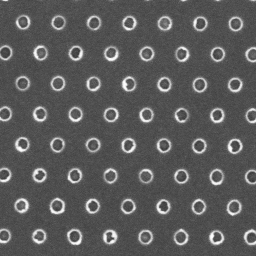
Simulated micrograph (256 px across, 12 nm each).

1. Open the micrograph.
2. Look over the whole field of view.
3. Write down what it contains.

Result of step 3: a regular array of holes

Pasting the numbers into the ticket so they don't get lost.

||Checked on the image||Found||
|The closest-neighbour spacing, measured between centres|0.418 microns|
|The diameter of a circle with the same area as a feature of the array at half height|132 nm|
